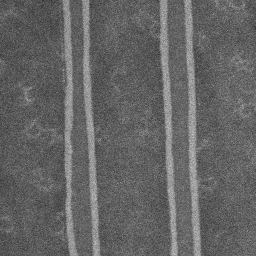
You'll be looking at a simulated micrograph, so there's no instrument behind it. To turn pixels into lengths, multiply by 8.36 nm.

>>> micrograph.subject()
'one or a few lines or trenches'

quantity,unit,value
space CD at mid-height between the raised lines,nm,662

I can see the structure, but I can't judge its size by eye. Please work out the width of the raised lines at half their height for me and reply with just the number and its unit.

0.191 µm